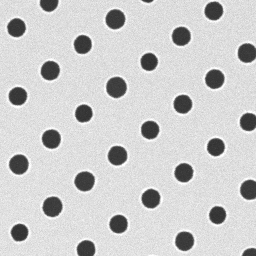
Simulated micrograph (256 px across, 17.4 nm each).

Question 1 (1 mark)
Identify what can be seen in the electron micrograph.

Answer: a regular array of holes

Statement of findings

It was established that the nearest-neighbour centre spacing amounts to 716 nm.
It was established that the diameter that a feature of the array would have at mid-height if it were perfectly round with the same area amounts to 349 nm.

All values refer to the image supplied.